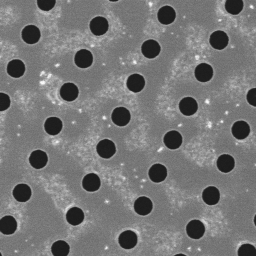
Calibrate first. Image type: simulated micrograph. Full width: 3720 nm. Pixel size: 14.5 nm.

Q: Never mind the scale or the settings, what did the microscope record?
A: a regular array of holes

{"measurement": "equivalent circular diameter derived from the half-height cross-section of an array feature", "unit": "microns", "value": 0.277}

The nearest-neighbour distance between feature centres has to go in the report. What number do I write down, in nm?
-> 531